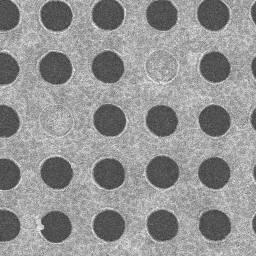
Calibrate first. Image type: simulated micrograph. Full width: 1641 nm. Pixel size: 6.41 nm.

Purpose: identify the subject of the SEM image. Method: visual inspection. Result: a regular array of holes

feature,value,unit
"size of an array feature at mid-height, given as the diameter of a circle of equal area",211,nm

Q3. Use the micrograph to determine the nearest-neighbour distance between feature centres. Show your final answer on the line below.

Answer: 335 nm